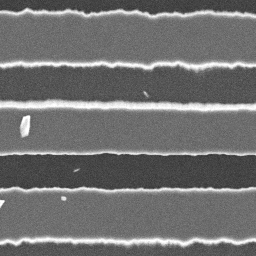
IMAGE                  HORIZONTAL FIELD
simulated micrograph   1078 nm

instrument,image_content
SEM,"lines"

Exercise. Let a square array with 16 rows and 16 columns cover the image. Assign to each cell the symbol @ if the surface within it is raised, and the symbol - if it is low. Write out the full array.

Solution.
----------------
@@@@@@@@@@@@@@@@
@@@@@@@@@@@@@@@@
@@@@@@@@@@@@@@@@
----------------
----------------
----------------
@@@@@@@@@@@@@@@@
@@@@@@@@@@@@@@@@
@@@@@@@@@@@@@@@@
----------------
----------------
@@@@@@@@@@@@@@@@
@@@@@@@@@@@@@@@@
@@@@@@@@@@@@@@@@
----------------